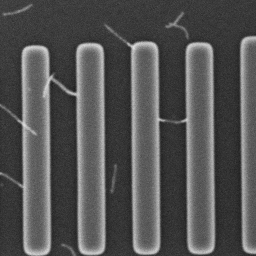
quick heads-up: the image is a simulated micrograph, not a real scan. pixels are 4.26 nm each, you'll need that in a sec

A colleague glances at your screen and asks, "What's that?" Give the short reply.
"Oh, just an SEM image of groups of lines, slits or small figures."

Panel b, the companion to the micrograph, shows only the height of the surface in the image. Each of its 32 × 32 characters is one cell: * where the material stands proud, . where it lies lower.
................................
................................
................................
................................
................................
..........**.....**.....**....**
...***....***...****...***....**
...***....***...****...****...**
...***....***...****...****...**
...***....***...****...****...**
...***....***...****...****...**
...***....***...****...****...**
...***....***...****...****...**
...***....***....***...****...**
...***....***....***...****...**
...***....***....***...****...**
...***....***....***...****...**
...***....***....***...****...**
...***....***....***...****...**
...***....***....***...****...**
...***....***....***...****...**
...***....***....***...****...**
...***....***....***...****...**
...***....***....***...****...**
...***....***....***...****...**
...***....***....***...****...**
...***....***....***...****...**
...***....***....***...****...**
...***....***....***...****...**
...***....***....***...****...**
...***....***....***....***...**
...***....***....**.....**.....*